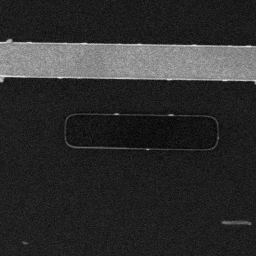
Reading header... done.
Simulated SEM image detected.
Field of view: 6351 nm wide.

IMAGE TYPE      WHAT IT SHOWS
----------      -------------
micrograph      groups of lines, slits or small figures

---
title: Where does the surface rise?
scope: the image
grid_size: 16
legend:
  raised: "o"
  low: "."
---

................
................
................
oooooooooooooooo
oooooooooooooooo
................
................
....ooooooooo...
....oooooooooo..
................
................
................
................
................
................
................